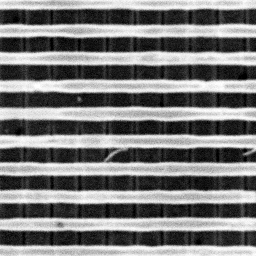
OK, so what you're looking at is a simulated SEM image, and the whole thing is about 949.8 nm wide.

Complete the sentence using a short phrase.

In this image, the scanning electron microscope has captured wiring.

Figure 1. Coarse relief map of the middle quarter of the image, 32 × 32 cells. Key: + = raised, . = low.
................................
................................
................................
................................
++++++++++++++++++++++++++++....
++++++++++++++++++++++++++++++++
++++++++++++++++++++++++++++++++
................................
................................
................................
................................
++++++++++++++++++++++++++++++++
++++++++++++++++++++++++++++++++
++++++++++++++++++++++++++++++++
................................
................................
................................
................................
++++++++++++++++++++++++++++++++
++++++++++++++++++++++++++++++++
+++..+++++++++++++++++++++++++++
................................
................................
................................
................................
++++++++++++++++++++++++++++++++
++++++++++++++++++++++++++++++++
+++++++++..++++.++++++++++++++++
................................
................................
................................
................................